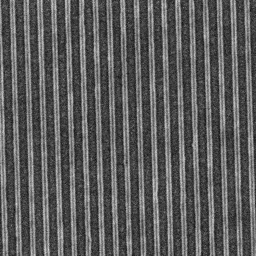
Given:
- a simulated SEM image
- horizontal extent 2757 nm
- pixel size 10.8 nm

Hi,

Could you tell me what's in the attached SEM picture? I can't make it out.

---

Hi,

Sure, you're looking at parallel lines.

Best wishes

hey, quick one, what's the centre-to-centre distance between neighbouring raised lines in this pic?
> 149 nm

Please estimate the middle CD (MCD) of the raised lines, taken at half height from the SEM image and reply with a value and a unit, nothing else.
0.039 µm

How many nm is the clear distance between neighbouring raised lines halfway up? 108